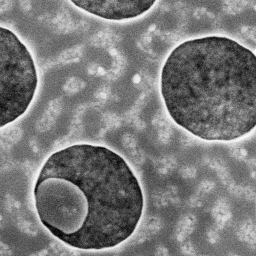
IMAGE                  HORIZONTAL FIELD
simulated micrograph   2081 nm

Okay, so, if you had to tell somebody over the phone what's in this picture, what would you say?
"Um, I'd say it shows holes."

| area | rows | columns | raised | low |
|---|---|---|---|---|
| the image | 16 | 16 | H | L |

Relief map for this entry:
HHHHHLLLLHHHHHHH
HHHHHHHHHHHHHHHH
LHHHHHHHHHHHLLLH
LLHHHHHHHHHLLLLL
LLHHHHHHHHLLLLLL
LLHHHHHHHHLLLLLL
LLHHHHHHHHLLLLLL
LHHHHHHHHHHLLLLL
HHHHHHHHHHHHLLLH
HHHHLLLHHHHHHHHH
HHHLLLLLHHHHHHHH
HHLLLLLLLHHHHHHH
HHLLLLLLLHHHHHHH
HHLLLLLLLHHHHHHH
HHHLLLLLHHHHHHHH
HHHHHLLHHHHHHHHH